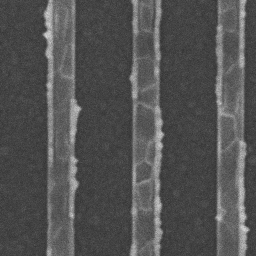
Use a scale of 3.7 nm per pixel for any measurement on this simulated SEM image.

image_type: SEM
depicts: one or a few lines or trenches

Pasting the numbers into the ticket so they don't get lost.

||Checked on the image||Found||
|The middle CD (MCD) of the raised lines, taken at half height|103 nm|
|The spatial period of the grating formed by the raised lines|315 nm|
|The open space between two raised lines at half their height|56.8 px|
